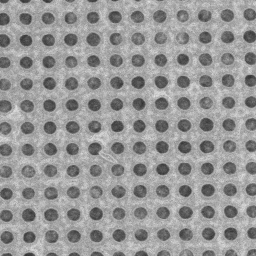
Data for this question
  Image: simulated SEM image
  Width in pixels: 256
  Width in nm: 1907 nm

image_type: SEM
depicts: a regular array of holes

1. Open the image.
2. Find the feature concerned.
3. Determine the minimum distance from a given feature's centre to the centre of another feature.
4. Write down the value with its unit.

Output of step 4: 162 nanometers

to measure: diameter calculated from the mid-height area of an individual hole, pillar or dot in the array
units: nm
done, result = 97.4